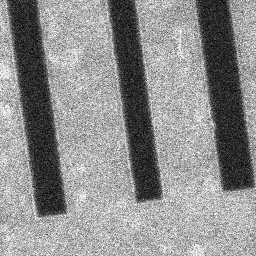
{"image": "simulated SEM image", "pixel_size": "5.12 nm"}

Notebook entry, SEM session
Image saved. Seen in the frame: one or a few lines or trenches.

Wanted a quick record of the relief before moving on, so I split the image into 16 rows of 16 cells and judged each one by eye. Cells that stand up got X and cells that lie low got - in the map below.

XXX----XX---XX--
XXX----XX---XXX-
-XX----XX---XXX-
-XX-X--XX----XX-
-XX----XX----XX-
-XX----XX----XX-
-XX-----X----XX-
-XXX----XX---XX-
--XX----XX---XXX
--XX----XX---XXX
--XX----XX----XX
--XX----XX----XX
--XX----XX------
--XX------------
----------------
----------------